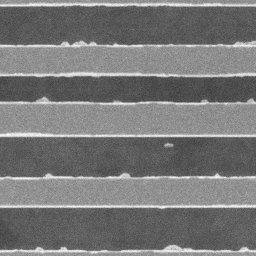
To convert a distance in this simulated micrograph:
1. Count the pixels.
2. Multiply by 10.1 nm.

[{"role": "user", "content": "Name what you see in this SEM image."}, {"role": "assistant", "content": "lines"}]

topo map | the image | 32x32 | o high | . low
oooooooooooooooooooooooooooooooo
................................
................................
................................
................................
................................
oooooooooooooooooooooooooooooooo
oooooooooooooooooooooooooooooooo
oooooooooooooooooooooooooooooooo
........................ooo.....
................................
................................
................................
oooooooooooooooooooooooooooooooo
oooooooooooooooooooooooooooooooo
oooooooooooooooooooooooooooooooo
oooooooooooooooooooooooooooooooo
................................
................................
................................
................................
................................
oooooooooooooooooooooooooooooooo
oooooooooooooooooooooooooooooooo
oooooooooooooooooooooooooooooooo
oooooooooooooooooooooooooooooooo
................................
................................
................................
................................
................................
oooooooooooooooooooooooooooooooo